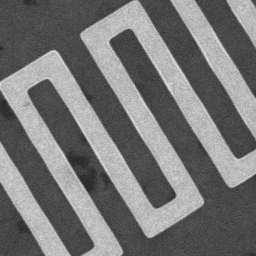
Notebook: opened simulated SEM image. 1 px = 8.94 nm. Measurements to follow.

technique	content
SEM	groups of lines, slits or small figures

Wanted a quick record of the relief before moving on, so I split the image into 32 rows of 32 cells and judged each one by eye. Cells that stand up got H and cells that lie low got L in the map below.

LLLLLLLLLLLLLLLLHLLLLLHHHLLLLHHH
LLLLLLLLLLLLLLHHHHLLLLHHHLLLLHHH
LLLLLLLLLLLLLHHHHHHLLLLHHHLLLLHH
LLLLLLLLLLLHHHHHHHHLLLLLHHLLLLLH
LLLLLLLLLLHHHHLLLHHHLLLLHHHLLLLH
LLLLLLLLLLLHHHLLLLHHHLLLLHHLLLLL
LLLLLLHLLLLHHHLLLLHHHLLLLHHHLLLL
LLLLLHHHLLLLHHHLLLLHHHLLLLHHHLLL
LLLHHHHHLLLLHHHLLLLLHHLLLLHHHHLL
LHHHHHHHHLLLLHHHLLLLHHHLLLLHHHLL
HHHHLLLHHHLLLLHHHLLLLHHHLLLLHHHL
HHHLLLLHHHLLLLHHHLLLLHHHLLLLHHHL
LHHHLLLLHHHLLLLHHHLLLLHHHLLLLHHH
LLHHLLLLLHHLLLLLHHLLLLLHHHLLLLHH
LLHHHLLLLHHHLLLLHHHLLLLHHHLLLLHH
LLLHHHLLLLHHHLLLLHHHLLLLHHHLLLLH
LLLHHHLLLLHHHLLLLHHHLLLLHHHLLLLH
LLLLHHHLLLLHHHLLLLHHHLLLLHHHLLLL
LLLLLHHLLLLLHHHLLLLHHHLLLLHHHLLL
HLLLLHHHLLLLHHHLLLLHHHLLLLHHHLLH
HHLLLLHHHLLLLHHHLLLLHHHLLLLHHHHH
HHLLLLHHHLLLLHHHLLLLHHHLLLLHHHHH
HHHLLLLHHHLLLLHHHLLLLHHHLLLLHHHL
LHHHLLLLHHLLLLLHHHLLLLHHHLLLLLLL
LHHHLLLLHHHLLLLHHHLLLLHHHLLLLLLL
LLHHHLLLLHHHLLLLHHHLLHHHHLLLLLLL
LLHHHLLLLLHHLLLLLHHHHHHHLLLLLLLL
LLLHHHLLLLHHHLLLLHHHHHLLLLLLLLLL
LLLLHHHLLLLHHHLLLLHHHLLLLLLLLLLL
LLLLHHHLLLLHHHLLLLLLLLLLLLLLLLLL
LLLLLHHHLLLLHHHLLLLLLLLLLLLLLLLL
LLLLLHHHLLLHHHHLLLLLLLLLLLLLLLLL